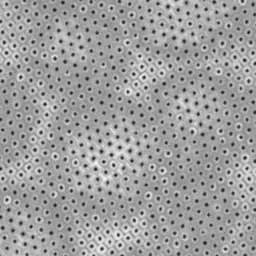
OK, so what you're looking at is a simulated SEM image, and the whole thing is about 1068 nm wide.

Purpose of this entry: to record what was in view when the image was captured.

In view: a regular array of holes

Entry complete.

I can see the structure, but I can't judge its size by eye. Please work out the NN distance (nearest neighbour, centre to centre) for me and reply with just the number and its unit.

42.5 nm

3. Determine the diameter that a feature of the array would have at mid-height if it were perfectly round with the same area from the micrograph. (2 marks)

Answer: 0.0149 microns